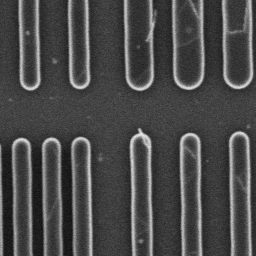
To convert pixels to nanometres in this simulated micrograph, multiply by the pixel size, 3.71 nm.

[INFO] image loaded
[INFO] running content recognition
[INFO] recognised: groups of lines, slits or small figures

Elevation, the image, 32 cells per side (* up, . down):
..***....**.....***...***...***.
..***....**.....***...***...***.
..***....**.....***...***...***.
...**....**.....***...***...***.
...**....**.....***...***...***.
...**....**.....***...***...***.
...**....**.....***...***...***.
...**....**.....***...***...***.
...**....**.....***...***...***.
...**....**.....***...***...***.
...**....**.....***...***....**.
................................
................................
................................
................................
................................
................................
..*...*..**.....***....**....**.
..**.**..**.....***....**....**.
..**.**..**.....***....**....**.
..**.**..**.....***....**....**.
..**.**..**......**....**....**.
..**.**..**......**....**....**.
..**..**.**......**....**....**.
..**..**.**......**....**....**.
..**..**.**......**....**....**.
..**..**.**......**....**....**.
..**..**.**......**....**....**.
..**..**.**......**....**....**.
..**..**.**......**....**....**.
..**..**.**......**....**....**.
..**..**.**......**....**....**.